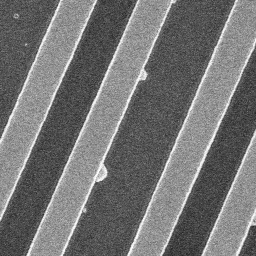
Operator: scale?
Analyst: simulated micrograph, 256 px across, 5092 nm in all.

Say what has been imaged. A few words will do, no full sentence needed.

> lines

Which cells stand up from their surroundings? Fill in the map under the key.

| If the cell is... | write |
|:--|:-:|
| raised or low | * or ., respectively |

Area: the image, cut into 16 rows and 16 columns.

....**..***....*
...**...**....**
...**...**....**
..***..**....***
..**...**....**.
.***..**....***.
.**...**....**..
.**..***....**..
**...**....**...
**..***....**..*
*...**....***..*
*...**....**...*
*..**....***..**
...**....**...**
..***....**..**.
..**....**...**.